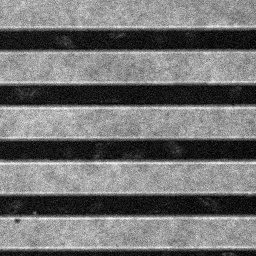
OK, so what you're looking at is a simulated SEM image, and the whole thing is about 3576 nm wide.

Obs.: parallel lines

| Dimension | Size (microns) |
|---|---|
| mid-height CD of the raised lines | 0.459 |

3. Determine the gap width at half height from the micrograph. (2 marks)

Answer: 314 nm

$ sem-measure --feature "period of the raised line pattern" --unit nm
770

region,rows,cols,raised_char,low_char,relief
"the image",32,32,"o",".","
oooooooooooooooooooooooooooooooo
oooooooooooooooooooooooooooooooo
oooooooooooooooooooooooooooooooo
oooooooooooooo..................
................................
................................
oooooooooooooooooooooooooooooooo
oooooooooooooooooooooooooooooooo
oooooooooooooooooooooooooooooooo
oooooooooooooooooooooooooooooooo
................................
................................
................................
oooooooooooooooooooooooooooooooo
oooooooooooooooooooooooooooooooo
oooooooooooooooooooooooooooooooo
oooooooooooooooooooooooooooooooo
................................
................................
................................
oooooooooooooooooooooooooooooooo
oooooooooooooooooooooooooooooooo
oooooooooooooooooooooooooooooooo
oooooooooooooooooooooooooooooooo
................................
................................
................................
oooooooooooooooooooooooooooooooo
oooooooooooooooooooooooooooooooo
oooooooooooooooooooooooooooooooo
oooooooooooooooooooooooooooooooo
................................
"